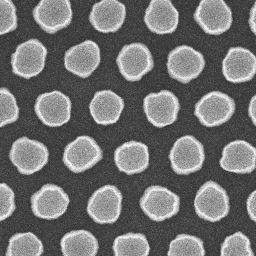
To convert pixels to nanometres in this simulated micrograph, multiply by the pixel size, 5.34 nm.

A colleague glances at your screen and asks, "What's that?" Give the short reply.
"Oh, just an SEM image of a regular array of raised bodies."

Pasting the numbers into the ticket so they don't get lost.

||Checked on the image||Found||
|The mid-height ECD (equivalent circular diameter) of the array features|182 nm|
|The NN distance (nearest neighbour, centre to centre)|274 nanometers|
